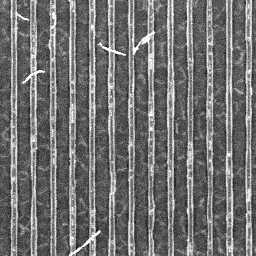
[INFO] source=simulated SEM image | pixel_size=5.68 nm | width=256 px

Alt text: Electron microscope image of parallel lines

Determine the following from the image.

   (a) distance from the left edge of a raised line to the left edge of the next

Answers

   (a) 111 nm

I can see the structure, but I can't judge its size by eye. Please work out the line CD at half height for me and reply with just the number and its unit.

28.4 nanometers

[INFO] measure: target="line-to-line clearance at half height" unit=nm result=84.4